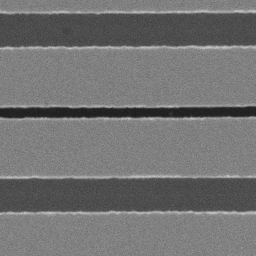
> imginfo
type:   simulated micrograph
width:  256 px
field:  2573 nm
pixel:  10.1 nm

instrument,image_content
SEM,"lines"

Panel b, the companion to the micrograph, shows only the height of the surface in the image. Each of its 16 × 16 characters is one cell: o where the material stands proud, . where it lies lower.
oooooooooooooooo
................
................
oooooooooooooooo
oooooooooooooooo
oooooooooooooooo
oooooooooooooooo
oooooooooooooooo
oooooooooooooooo
oooooooooooooooo
oooooooooooooooo
................
................
oooooooooooooooo
oooooooooooooooo
oooooooooooooooo